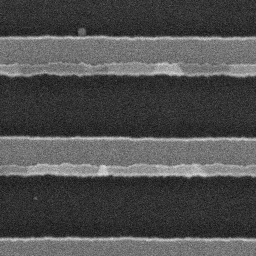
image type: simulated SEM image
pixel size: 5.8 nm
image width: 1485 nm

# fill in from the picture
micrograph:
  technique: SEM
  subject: lines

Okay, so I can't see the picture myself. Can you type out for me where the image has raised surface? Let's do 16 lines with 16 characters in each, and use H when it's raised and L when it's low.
LLLLLLLLLLLLLLLL
LLLLLLLLLLLLLLLL
HHHHHHHHHHHHHHHH
HHHHHHHHHHHHHHHH
HHHHHHHHHHHHHHHH
LLLLLLLLLLLLLLLL
LLLLLLLLLLLLLLLL
LLLLLLLLLLLLLLLL
LLLLLLLLLLLLLLLL
HHHHHHHHHHHHHHHH
HHHHHHHHHHHHHHHH
LLLLLLLLLLLLLLLL
LLLLLLLLLLLLLLLL
LLLLLLLLLLLLLLLL
LLLLLLLLLLLLLLLL
HHHHHHHHHHHHHHHH